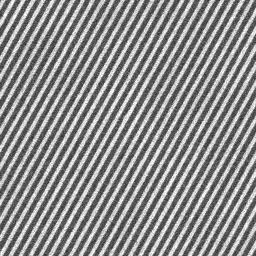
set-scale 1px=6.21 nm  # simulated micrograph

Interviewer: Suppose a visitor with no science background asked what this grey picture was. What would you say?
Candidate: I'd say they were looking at parallel lines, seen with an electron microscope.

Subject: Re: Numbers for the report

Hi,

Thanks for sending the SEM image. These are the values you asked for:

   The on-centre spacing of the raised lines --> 0.0541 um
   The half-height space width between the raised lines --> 34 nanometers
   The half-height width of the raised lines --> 2.72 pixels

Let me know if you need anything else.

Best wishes